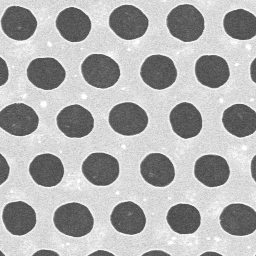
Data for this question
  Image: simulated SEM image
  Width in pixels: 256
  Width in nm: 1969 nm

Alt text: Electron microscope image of a regular array of holes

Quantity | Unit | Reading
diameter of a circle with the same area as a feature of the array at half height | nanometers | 273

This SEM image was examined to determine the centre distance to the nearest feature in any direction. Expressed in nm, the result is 418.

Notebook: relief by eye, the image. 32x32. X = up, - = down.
XXXXXXXXXXXXXXXXXXXXXXXXXXXXXXXX
X---XXXX--XXXX----XXX----XXXX--X
-----XX----XXX-----XX-----XX----
-----XX----XXX----XXX-----XX----
X---XXXX---XXXX---XXXX---XXXX---
XXXXXXXXXXXXXXXXXXXXXXXXXXXXXXXX
XXXXXXXXXXXXXXXXXXXXXXXXXXXXXXXX
XXXX---XXXX---XXXX---XXXX---XXXX
-XX-----XX-----XXX----XX-----XX-
-XX-----XX-----XXX----XX-----XX-
XXXX----XXX---XXXX----XXX---XXXX
XXXXXXXXXXXXXXXXXXXXXXXXXXXXXXXX
XXXXXXXXXXXXXXXXXXXXXXXXXXXXXXXX
----XXXX---XXX----XXXX---XXX---X
-----XX-----XX----XXX----XXX----
-----XX-----XX----XXX----XXX----
X---XXXX---XXXX---XXXX---XXXX---
XXXXXXXXXXXXXXXXXXXXXXXXXXXXXXXX
XXXXXXXXXXXXXXXXXXXXXXXXXXXXXXXX
XXXXX--XXXX---XXXX---XXXX--XXXXX
-XXX----XX-----XXX----XX----XXX-
-XXX----XX-----XXX----XX-----XX-
-XXX----XXX---XXXX----XXX---XXXX
XXXXXXXXXXXXXXXXXXXXXXXXXXXXXXXX
XXXXXXXXXXXXXXXXXXXXXXXXXXXXXXXX
X--XXXXX--XXXXX--XXXXX-XXXXXX-XX
----XXX----XXX----XXX----XXX----
-----XX-----XX----XXX----XX-----
X---XXX----XXX----XXX----XXX----
XXXXXXXXX-XXXXXXXXXXXXXXXXXXXXXX
XXXXXXXXXXXXXXXXXXXXXXXXXXXXXXXX
XXXX---XXXXX--XXXX---XXXXXXXXXXX